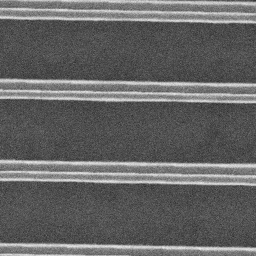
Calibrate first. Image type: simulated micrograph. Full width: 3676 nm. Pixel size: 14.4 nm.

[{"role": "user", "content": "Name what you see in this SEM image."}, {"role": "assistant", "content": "lines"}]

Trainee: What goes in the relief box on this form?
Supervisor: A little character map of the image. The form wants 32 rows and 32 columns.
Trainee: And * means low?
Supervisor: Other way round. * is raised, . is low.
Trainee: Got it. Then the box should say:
********************************
********************************
..................**************
................................
................................
................................
................................
................................
................................
................................
**********************..........
********************************
....................************
................................
................................
................................
................................
................................
................................
................................
***********.....................
********************************
...*****************************
................................
................................
................................
................................
................................
................................
................................
................................
********************************